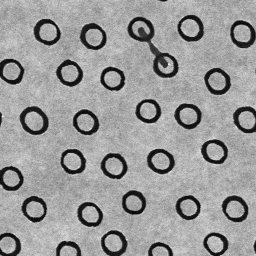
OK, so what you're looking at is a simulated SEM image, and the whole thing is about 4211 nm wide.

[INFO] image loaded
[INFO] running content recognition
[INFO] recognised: a regular array of ring-shaped grooves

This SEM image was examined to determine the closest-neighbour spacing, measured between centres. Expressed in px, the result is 44.3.